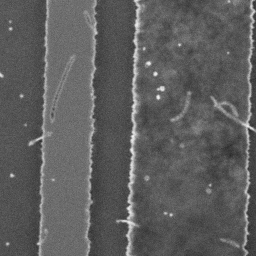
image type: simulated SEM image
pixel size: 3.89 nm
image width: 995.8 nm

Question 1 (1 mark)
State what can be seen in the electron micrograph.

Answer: lines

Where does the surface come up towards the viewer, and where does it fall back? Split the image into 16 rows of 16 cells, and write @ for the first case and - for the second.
---@@@---@@@@@@@
---@@@---@@@@@@@
---@@@--@@@@@@@@
---@@@--@@@@@@@@
---@@@--@@@@@@@@
---@@@--@@@@@@@@
---@@@--@@@@@@@@
---@@@--@@@@@@@@
---@@@--@@@@@@@@
---@@@--@@@@@@@@
---@@@--@@@@@@@@
---@@@--@@@@@@@@
---@@@--@@@@@@@-
---@@@--@@@@@@@-
---@@@--@@@@@@@-
--@@@@--@@@@@@@-